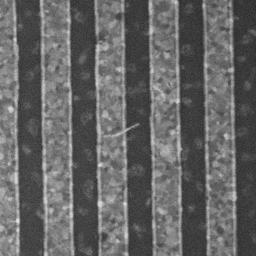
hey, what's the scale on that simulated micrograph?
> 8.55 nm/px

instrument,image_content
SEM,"parallel lines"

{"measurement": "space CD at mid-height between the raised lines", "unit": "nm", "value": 243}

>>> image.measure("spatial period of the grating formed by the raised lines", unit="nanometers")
464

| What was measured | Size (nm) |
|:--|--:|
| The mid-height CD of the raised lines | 226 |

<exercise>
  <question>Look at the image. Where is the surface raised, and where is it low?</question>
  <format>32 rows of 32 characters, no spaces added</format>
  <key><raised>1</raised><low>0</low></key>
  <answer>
11000111100011100001110000111000
11000111100011100001110000111000
11000111100011100001110000111000
11000111100011100001110000111000
11000111100011100001110000111000
11000111100011100001110000111000
11000111100011100001110000111000
11000111100011100001110000111000
11000111100011100001110000111000
11000011100011100001110000111000
11000011100011100001110000111000
11000111100011100001110000111000
11000111100011100001110000111000
11000111100011110001110000111000
11000111100011100001110000111000
11000111100011100001110000111000
11000111100011110001110000111000
11000011100011100001110000111000
11000011100011110001110000111000
11000011100011110001110000111000
11000011100011110001110000111000
11000011100011110001110000111000
11000011100011110001111000111000
11000011100011110001110000111000
11000011100001110001110000111000
11000011100001110001110000111000
11000011100001110001111000111000
11000011100001110001110000111000
11000011100011110001110000111000
11000011100001110001111000111000
11000011100001110001111000111000
11000011100001110001111000111000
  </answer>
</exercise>